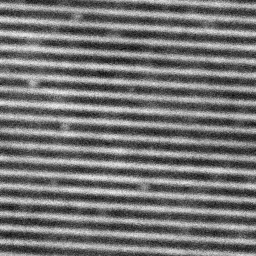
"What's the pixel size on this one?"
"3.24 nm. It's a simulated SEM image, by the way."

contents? parallel lines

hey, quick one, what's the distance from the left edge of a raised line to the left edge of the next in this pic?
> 44.8 nm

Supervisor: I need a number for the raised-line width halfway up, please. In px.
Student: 2.75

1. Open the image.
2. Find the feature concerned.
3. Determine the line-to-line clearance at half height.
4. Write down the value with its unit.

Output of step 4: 0.038 um